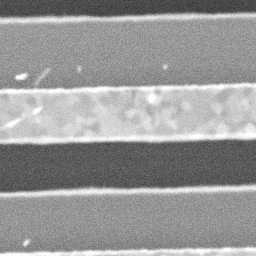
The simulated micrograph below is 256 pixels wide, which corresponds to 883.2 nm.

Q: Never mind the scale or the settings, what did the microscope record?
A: lines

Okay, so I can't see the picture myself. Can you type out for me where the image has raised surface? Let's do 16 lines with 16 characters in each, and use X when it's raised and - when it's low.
----------------
XXXXXXXXXXXXXXXX
XXXXXXXXXXXXXXXX
XXXXXXXXXXXXXXXX
XXXXXXXXXXXXXXXX
XXXXXXXXXXXXXXXX
XXXXXXXXXXXXXXXX
XXXXXXXXXXXXXXXX
XXXXXXXXXXXXXXXX
----------------
----------------
----------------
XXXXXXXXXXXXXXXX
XXXXXXXXXXXXXXXX
XXXXXXXXXXXXXXXX
XXXXXXXXXXXXXXXX